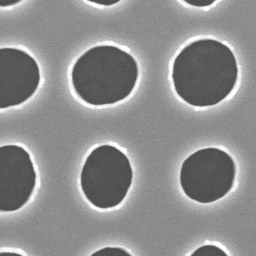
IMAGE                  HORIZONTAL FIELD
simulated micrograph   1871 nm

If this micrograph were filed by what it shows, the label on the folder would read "holes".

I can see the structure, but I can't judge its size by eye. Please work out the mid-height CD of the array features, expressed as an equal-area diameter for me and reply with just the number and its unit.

437 nm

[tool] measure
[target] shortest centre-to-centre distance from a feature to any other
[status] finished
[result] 101 px